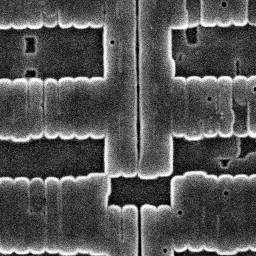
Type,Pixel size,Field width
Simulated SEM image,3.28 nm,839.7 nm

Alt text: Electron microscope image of wiring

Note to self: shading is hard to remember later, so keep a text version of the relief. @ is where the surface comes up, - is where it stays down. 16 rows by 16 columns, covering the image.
@@@@@@@@@@@@@@@@
@@@@@@@@@@@@@@@-
-------@@@@-----
-------@@@@-----
------@@@@@-----
@@@@@@@@@@@@@@@@
@@@@@@@@@@@@@@@@
@@@@@@@@@@@@@@@@
@@@@@@@@@@@@@---
-------@@@@-----
------@@@@@-----
@@@@@@@----@@@@@
@@@@@@@----@@@@@
@@@@@@@@@@@@@@@@
@@@@@@@@@@@@@@@@
@@@@@@@@@@@@@@@@